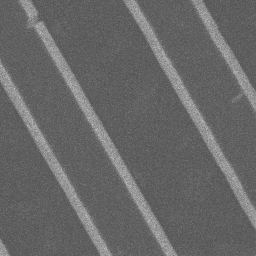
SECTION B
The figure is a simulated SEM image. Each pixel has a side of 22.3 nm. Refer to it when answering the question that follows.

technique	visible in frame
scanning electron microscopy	one or a few lines or trenches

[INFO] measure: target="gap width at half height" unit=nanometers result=1990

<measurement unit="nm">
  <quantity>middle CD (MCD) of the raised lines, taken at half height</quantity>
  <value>1290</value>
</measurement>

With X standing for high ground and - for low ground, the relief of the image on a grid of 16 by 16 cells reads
XX------XXXXX---
XX-------XXXX---
XXX------XXXXX--
XXXX------XXXX--
XXXX-------XXXX-
-XXXX------XXXXX
-XXXX-------XXXX
--XXXX------XXXX
--XXXX-------XXX
---XXXX------XXX
---XXXXX------XX
----XXXX-------X
-----XXXX------X
-----XXXX-------
------XXXX------
------XXXXX-----